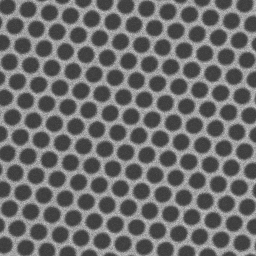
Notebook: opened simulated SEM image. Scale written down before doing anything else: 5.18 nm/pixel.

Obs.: a regular array of holes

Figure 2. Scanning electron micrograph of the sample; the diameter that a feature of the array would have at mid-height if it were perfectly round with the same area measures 86.3 nm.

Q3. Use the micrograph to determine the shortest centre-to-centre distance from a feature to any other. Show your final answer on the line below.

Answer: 108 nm